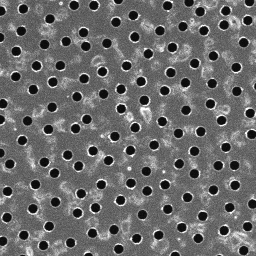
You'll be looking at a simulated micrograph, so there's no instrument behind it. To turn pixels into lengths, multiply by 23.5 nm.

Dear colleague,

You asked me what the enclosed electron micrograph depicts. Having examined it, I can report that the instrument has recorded a regular array of holes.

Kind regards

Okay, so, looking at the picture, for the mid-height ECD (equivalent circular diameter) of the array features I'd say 0.225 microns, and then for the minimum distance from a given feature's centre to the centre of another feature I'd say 472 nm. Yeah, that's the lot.